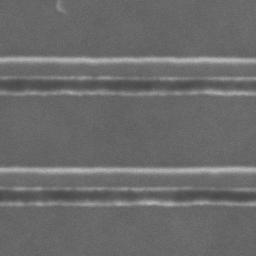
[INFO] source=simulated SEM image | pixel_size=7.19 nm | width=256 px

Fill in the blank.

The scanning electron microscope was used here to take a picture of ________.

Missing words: lines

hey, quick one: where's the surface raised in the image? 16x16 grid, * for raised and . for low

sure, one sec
................
................
................
................
****************
****************
................
................
................
................
................
****************
****************
................
................
................